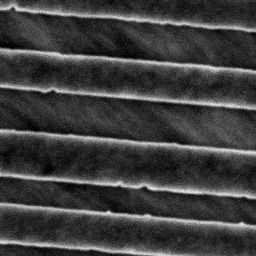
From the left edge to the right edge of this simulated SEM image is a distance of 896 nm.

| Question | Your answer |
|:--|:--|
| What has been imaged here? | one or a few lines or trenches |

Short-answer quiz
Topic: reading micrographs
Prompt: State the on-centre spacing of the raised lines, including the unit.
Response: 281 nanometers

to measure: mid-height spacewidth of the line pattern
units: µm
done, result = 0.137